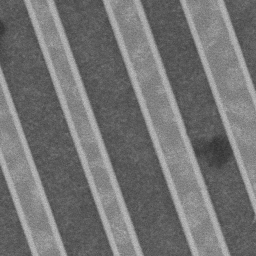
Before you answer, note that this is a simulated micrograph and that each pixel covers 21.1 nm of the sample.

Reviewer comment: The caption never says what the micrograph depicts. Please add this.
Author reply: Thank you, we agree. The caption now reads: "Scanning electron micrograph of one or a few lines or trenches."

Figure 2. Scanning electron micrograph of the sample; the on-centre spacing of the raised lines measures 1620 nm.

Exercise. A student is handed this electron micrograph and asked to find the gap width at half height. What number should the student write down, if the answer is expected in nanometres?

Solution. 1070